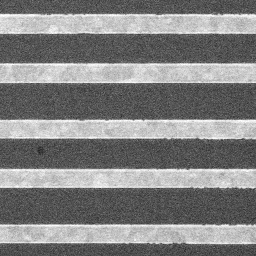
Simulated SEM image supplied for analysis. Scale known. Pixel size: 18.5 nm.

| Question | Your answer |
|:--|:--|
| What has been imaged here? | lines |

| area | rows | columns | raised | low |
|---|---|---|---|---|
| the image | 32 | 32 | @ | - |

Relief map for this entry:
--------------------------------
--------------------------------
@@@@@@@@@@@@@@@@@@@@@@@@@@@@@@@@
@@@@@@@@@@@@@@@@@@@@@@@@@@@@@@@@
--------------------------------
--------------------------------
--------------------------------
--------------------------------
@@@@@@@@@@@@@@@@@@@@@@@@@@@@@@@@
@@@@@@@@@@@@@@@@@@@@@@@@@@@@@@@@
--------------------------------
--------------------------------
--------------------------------
--------------------------------
--------------------------------
@@@@@@@@@@@@@@@@@@@@@@@@@@@@@@@@
@@@@@@@@@@@@@@@@@@@@@@@@@@@@@@@@
--------------------------------
--------------------------------
--------------------------------
--------------------------------
@@@@@@@@@@@@@@@@@@@@@@@@@@@@@@@@
@@@@@@@@@@@@@@@@@@@@@@@@@@@@@@@@
--------------------------------
--------------------------------
--------------------------------
--------------------------------
--------------------------------
@@@@@@@@@@@@@@@@@@@@@@@@@@@@@@@@
@@@@@@@@@@@@@@@@@@@@@@@@@@@@@@@@
--------------------------------
--------------------------------